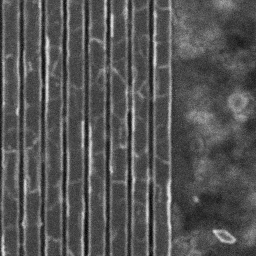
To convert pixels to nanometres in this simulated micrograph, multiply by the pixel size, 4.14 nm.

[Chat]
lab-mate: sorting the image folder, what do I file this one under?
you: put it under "parallel lines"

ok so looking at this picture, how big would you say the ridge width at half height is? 67.3 nanometers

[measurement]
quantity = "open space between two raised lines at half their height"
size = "22.3 nm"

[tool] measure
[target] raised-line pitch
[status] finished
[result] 21.7 px